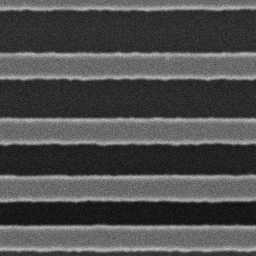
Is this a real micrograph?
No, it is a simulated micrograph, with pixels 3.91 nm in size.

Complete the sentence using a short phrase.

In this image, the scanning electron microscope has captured lines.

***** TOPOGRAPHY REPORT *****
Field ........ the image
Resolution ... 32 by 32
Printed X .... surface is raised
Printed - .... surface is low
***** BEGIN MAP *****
XXXXXXXXXXXXXXXXXXXXXXXXXXXXXXXX
--------------------------------
--------------------------------
--------------------------------
--------------------------------
--------------------------------
--------------------------------
XXXXXXXXXXXXXXXXXXXXXXXXXXXXXXXX
XXXXXXXXXXXXXXXXXXXXXXXXXXXXXXXX
XXXXXXXXXXXXXXXXXXXXXXXXXXXXXXXX
--------------------------------
--------------------------------
--------------------------------
--------------------------------
--------------------------------
XXXXXXXXXXXXXXXXXXXXXXXXXXXXXXXX
XXXXXXXXXXXXXXXXXXXXXXXXXXXXXXXX
XXXXXXXXXXXXXXXXXXXXXXXXXXXXXXXX
--------------------------------
--------------------------------
--------------------------------
--------------------------------
XXXXXXXXXXXXXXXXXXXXXXXXXXXXXXXX
XXXXXXXXXXXXXXXXXXXXXXXXXXXXXXXX
XXXXXXXXXXXXXXXXXXXXXXXXXXXXXXXX
--------------------------------
--------------------------------
--------------------------------
XXXXXXXXXXXXXXXXXXXXXXXXXXXXXXXX
XXXXXXXXXXXXXXXXXXXXXXXXXXXXXXXX
XXXXXXXXXXXXXXXXXXXXXXXXXXXXXXXX
--------------------------------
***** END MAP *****